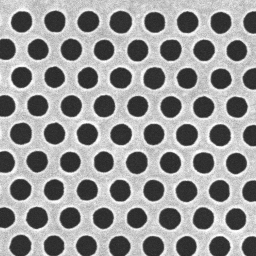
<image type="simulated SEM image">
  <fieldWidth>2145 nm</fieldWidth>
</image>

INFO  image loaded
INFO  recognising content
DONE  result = a regular array of holes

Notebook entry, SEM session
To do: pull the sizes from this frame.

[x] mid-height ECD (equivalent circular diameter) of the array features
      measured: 183 nanometres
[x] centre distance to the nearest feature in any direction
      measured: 0.27 micrometres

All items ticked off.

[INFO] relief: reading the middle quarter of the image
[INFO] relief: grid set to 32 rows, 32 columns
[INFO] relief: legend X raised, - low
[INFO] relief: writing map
XXXXXXXXXXXXXXXXXXXXXXXXXXXXXXXX
XXXX----XXXX----XXXXX----XXXX---
XXXX----XXX------XXX-----XXX----
XXX------XX------XXX-----XXX----
XXXX-----XX------XXX-----XXX----
XXXX----XXXX----XXXX-----XXXX---
XXXXXXXXXXXXXXXXXXXXXX-XXXXXXXXX
XXXXXXXXXXXXXXXXXXXXXXXXXXXXXXXX
----XXXX----XXXXX---XXXXX---XXXX
----XXXX-----XXX-----XXX-----XXX
----XXX------XXX-----XXX------XX
----XXXX-----XXX-----XXX-----XXX
----XXXX----XXXXX---XXXXX----XXX
XXXXXXXXXXXXXXXXXXXXXXXXXX-XXXXX
XXXXXXXXXXXXXXXXXXXXXXXXXXXXXXXX
XXXX----XXXXX---XXXXX---XXXXX---
XXX-----XXXX-----XXX-----XXX----
-XX------XX------XXX-----XXX----
XXX-----XXXX-----XXX-----XXX----
XXXX----XXXX----XXXXX---XXXXX---
XXXXXXXXXXXXXX-XXXXXXXXXXXXXXX-X
XXXXXXXXXXXXXXXXXXXXXXXXXXXXXXXX
---XXXXX----XXXX----XXXXX---XXXX
----XXXX----XXXX-----XXX-----XXX
----XXX------XX------XXX-----XXX
----XXX-----XXX------XXX-----XXX
---XXXXX----XXXX----XXXXX----XXX
XXXXXXXXXXXXXXXXX--XXXXXXXXXXXXX
XXXXXXXXXXXXXXXXXXXXXXXXXXXXXXXX
XXXX----XXXX----XXXXX---XXXXX---
XXX-----XXXX----XXXX-----XXX----
XXX------XX------XXX-----XXX----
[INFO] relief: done